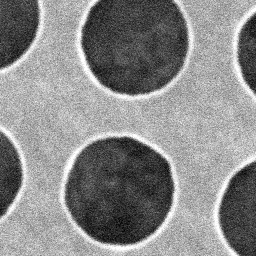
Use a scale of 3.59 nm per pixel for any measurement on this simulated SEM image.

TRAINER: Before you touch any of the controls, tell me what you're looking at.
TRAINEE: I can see holes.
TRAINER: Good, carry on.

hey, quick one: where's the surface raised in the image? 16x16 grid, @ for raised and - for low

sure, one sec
--@@@@-----@@@@@
--@@@-------@@@-
--@@@-------@@@-
-@@@@-------@@@-
@@@@@@-----@@@@-
@@@@@@@---@@@@@@
@@@@@@@@@@@@@@@@
@@@@@@@@@@@@@@@@
@@@@@@@@@@@@@@@@
-@@@@-----@@@@@@
-@@@-------@@@@-
-@@@-------@@@--
-@@@-------@@@--
@@@@------@@@@--
@@@@@-----@@@@--
@@@@@@@@@@@@@@--